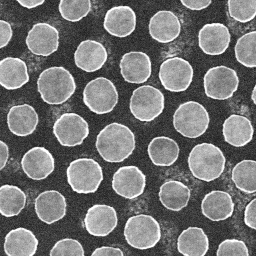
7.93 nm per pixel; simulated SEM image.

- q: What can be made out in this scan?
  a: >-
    a regular array of raised bodies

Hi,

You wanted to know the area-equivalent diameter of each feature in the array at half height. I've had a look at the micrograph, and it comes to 251 nanometres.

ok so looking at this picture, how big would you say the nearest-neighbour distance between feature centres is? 0.351 microns